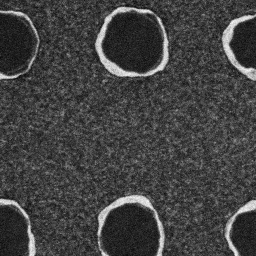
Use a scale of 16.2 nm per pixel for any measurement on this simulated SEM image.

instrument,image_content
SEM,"raised bodies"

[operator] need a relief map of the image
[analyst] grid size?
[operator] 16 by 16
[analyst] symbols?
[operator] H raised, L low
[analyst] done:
LLLLLLLLLLLLLLLL
HHLLLLLHHHLLLLLH
HHLLLLHHHHLLLLHH
HHLLLLHHHHLLLLHH
HHLLLLLLHHLLLLLL
LLLLLLLLLLLLLLLL
LLLLLLLLLLLLLLLL
LLLLLLLLLLLLLLLL
LLLLLLLLLLLLLLLL
LLLLLLLLLLLLLLLL
LLLLLLLLLLLLLLLL
LLLLLLLLLLLLLLLL
LLLLLLLLHLLLLLLL
HHLLLLHHHHLLLLLH
HHLLLLHHHHLLLLHH
HHLLLLHHHHLLLLLH